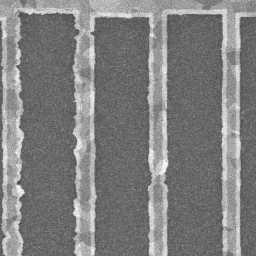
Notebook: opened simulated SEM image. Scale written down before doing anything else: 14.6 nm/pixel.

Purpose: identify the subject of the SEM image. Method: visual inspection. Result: one or a few lines or trenches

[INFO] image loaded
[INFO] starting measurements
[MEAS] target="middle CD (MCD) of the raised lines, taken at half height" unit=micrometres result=0.203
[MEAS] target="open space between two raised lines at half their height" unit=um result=0.859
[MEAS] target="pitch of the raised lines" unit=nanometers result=1070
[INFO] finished